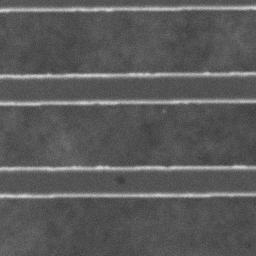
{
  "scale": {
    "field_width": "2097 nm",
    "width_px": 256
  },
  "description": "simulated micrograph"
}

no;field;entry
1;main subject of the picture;lines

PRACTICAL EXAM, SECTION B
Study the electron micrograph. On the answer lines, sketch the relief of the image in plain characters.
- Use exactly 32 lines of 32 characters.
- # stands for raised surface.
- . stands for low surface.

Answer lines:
################################
................................
................................
................................
................................
................................
................................
................................
................................
################################
################################
################################
################################
................................
................................
................................
................................
................................
................................
................................
................................
################################
################################
################################
#######.........................
................................
................................
................................
................................
................................
................................
................................